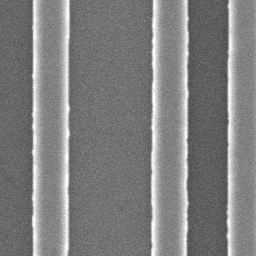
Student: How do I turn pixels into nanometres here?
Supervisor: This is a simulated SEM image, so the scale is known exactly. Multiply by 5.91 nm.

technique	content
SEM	lines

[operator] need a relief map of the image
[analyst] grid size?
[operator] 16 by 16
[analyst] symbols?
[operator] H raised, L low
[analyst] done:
LLHHLLLLLLHHLLHH
LLHHLLLLLLHHLLHH
LLHHLLLLLLHHLLHH
LLHHLLLLLLHHLLHH
LLHHLLLLLLHHLLHH
LLHHLLLLLLHHLLHH
LLHHLLLLLLHHLLHH
LLHHLLLLLLHHLLHH
LLHHLLLLLLHHLLHH
LLHHLLLLLLHHLLHH
LLHHLLLLLLHHLLHH
LLHHLLLLLLHHLLHH
LLHHLLLLLLHHLLHH
LLHHLLLLLLHHLLHH
LLHHLLLLLLHHLLHH
LLHHLLLLLLHHLLHH